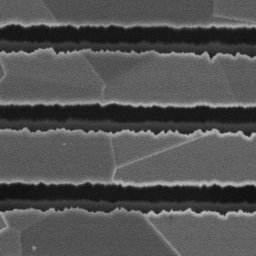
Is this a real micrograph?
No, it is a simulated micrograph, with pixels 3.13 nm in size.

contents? lines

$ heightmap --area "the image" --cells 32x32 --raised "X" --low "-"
XXXXXXXXXXXXXXXXXXXXXXXXXXXXXXXX
XXXXXXXXXXXXXXXXXXXXXXXXXXXXXXXX
XXXXXXXXXXXXXXXXXXXXXXXXXXXXXXXX
---------------------XX------X--
--------------------------------
--------------------------------
--X-XXX--XXXXXX---XX------------
XXXXXXXXXXXXXXXXXXXXXXXXXXXXXXXX
XXXXXXXXXXXXXXXXXXXXXXXXXXXXXXXX
XXXXXXXXXXXXXXXXXXXXXXXXXXXXXXXX
XXXXXXXXXXXXXXXXXXXXXXXXXXXXXXXX
XXXXXXXXXXXXXXXXXXXXXXXXXXXXXXXX
XXXXXXXXXXXXXXXXXXXXXXXXXXXXXXXX
--------------------------------
--------------------------------
--------------------------------
XXXXXXXXXXXXX--XXXX-XX--XXXX----
XXXXXXXXXXXXXXXXXXXXXXXXXXXXXXXX
XXXXXXXXXXXXXXXXXXXXXXXXXXXXXXXX
XXXXXXXXXXXXXXXXXXXXXXXXXXXXXXXX
XXXXXXXXXXXXXXXXXXXXXXXXXXXXXXXX
XXXXXXXXXXXXXXXXXXXXXXXXXXXXXXXX
XXXXXXXXXXXXXXXXXXXXXXXXXXXXXXXX
--------------------------------
--------------------------------
--------------------------------
XXXXXXXXXXX-X-XXXX--XXXX-XX--XX-
XXXXXXXXXXXXXXXXXXXXXXXXXXXXXXXX
XXXXXXXXXXXXXXXXXXXXXXXXXXXXXXXX
XXXXXXXXXXXXXXXXXXXXXXXXXXXXXXXX
XXXXXXXXXXXXXXXXXXXXXXXXXXXXXXXX
XXXXXXXXXXXXXXXXXXXXXXXXXXXXXXXX